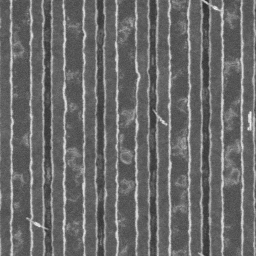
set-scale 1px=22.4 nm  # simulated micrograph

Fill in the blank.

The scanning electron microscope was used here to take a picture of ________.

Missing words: parallel lines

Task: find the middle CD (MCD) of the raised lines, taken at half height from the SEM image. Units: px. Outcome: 12.9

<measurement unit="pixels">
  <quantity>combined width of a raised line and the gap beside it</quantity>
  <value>26.3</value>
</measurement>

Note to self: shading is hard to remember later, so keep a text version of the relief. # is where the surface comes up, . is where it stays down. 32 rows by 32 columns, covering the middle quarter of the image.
.....###..###.....###..###.....#
.....###..###.....###..###.....#
.....###..###......##..###.....#
.....###..###......##..###.....#
.....###..###......##..###.....#
.....###..###.....###..###......
.....###..###.....###..###.....#
.....###..###.....###..###.....#
.....###..###.....###..###.....#
.....###..###.....###..###.....#
.....###..###.....###..###.....#
.....###..###.....###..###.....#
.....###..###.....###..###.....#
.....###..###.....###..###.....#
.....###..###.....###..###.....#
.....###..###.....###..###.....#
.....###..###.....###..###.....#
.....###..###.....###..###.....#
.....###..###.....###..###.....#
.....###..###.....###..###.....#
.....###..###.....###..###.....#
.....###..###.....###..###.....#
.....###..###.....###..###.....#
.....###..###.....###..###......
.....###..###.....###...##.....#
.....###..###.....###...###....#
.....###..###.....###..###.....#
.....###..###.....###..###.....#
.....###..###.....###..###.....#
.....###..###.....###..###.....#
.....###..###.....###..###.....#
.....###..###.....###..###.....#